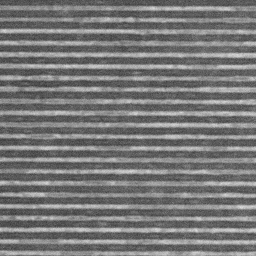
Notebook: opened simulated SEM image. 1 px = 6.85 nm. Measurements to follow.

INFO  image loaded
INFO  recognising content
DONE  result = parallel lines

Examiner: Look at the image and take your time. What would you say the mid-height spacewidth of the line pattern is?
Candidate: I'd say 63.3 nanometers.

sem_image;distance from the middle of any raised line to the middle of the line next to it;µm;0.08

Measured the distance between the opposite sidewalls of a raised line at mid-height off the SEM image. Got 18.8 nm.